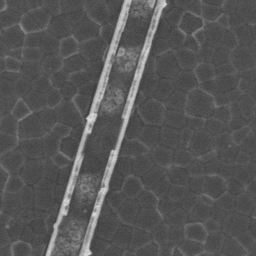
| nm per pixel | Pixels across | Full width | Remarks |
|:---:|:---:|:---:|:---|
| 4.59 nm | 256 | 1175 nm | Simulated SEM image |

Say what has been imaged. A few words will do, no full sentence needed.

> one or a few lines or trenches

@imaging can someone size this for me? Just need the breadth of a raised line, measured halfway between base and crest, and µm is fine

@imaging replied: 0.168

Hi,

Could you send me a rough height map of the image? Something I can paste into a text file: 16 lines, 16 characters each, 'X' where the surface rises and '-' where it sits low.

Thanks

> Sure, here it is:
--------XX------
-------XXX------
-------XX-------
-------XX-------
------XXX-------
------XXX-------
------XX--------
-----XXX--------
-----XXX--------
-----XX---------
-----XX---------
----XXX---------
----XX----------
----XX----------
---XXX----------
---XXX----------